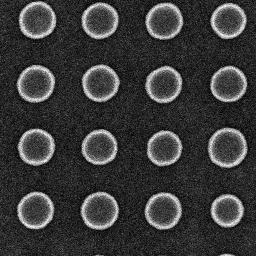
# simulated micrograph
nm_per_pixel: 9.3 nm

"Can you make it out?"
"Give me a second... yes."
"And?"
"a regular array of raised bodies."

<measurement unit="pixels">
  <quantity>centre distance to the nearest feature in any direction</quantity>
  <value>63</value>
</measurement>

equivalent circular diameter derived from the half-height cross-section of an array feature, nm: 319